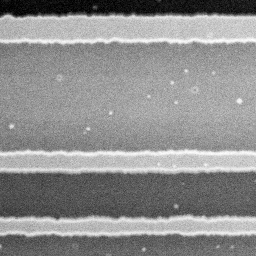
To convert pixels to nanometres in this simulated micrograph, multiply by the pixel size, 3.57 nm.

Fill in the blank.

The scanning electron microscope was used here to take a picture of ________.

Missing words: lines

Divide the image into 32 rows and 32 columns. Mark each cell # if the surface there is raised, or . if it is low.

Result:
................................
................................
################################
################################
################################
................................
................................
................................
................................
................................
................................
................................
................................
................................
................................
................................
................................
................................
................................
################################
################################
................................
................................
................................
................................
................................
................................
#######...####.###..############
################################
................................
................................
................................